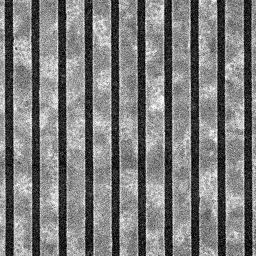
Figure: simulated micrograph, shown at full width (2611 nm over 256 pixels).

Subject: parallel lines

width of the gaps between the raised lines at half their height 84.2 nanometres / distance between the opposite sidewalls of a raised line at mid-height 184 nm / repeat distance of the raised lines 270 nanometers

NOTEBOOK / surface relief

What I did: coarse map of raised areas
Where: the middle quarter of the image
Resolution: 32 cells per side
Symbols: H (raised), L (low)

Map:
LHHHHLLHHHHHLLHHHHLLLHHHHLLHHHHL
LHHHHLLHHHHHLLHHHHLLLHHHHLLHHHHL
LHHHHLLHHHHHLLHHHHLLLHHHHLLHHHHL
LHHHHLLHHHHHLLHHHHLLLHHHHLLHHHHL
LHHHHLLHHHHHLLHHHHLLLHHHHLLHHHHL
LHHHHLLHHHHHLLHHHHLLLHHHHLLHHHHL
LHHHHLLHHHHHLLHHHHLLLHHHHLLHHHHL
LHHHHLLHHHHHLLHHHHLLLHHHHLLHHHHL
LHHHHLLHHHHHLLHHHHLLLHHHHLLHHHHL
LHHHHLLHHHHHLLHHHHLLLHHHHLLHHHHL
LHHHHLLHHHHHLLHHHHLLLHHHHLLHHHHL
LHHHHLLHHHHHLLHHHHLLLHHHHLLHHHHL
LHHHHLLHHHHHLLHHHHLLLHHHHLLHHHHL
LHHHHLLHHHHHLLHHHHLLLHHHHLLHHHHL
LHHHHLLHHHHHLLHHHHLLLHHHHLLHHHHH
LHHHHLLHHHHHLLHHHHLLLHHHHLLHHHHH
LHHHHLLHHHHLLLHHHHLLLHHHHLLHHHHH
LHHHHLLHHHHHLLHHHHLLLHHHHLLHHHHH
LHHHHLLHHHHLLLHHHHLLLHHHHLLHHHLH
LHHHHLLHHHHLLLHHHHLLLHHHHLLHHHHH
LHLLHLLHHHHHLLHHHHLLLHHHHLLHHHHH
LHHHHLLHHHHHLLHHHHLLLHHHHLLHHHLH
LHHHHLLHHHHHLLHHHHLLLHHHHLLHHHHH
LHHHHLLHHHHHLLHHHHLLLHHHHLLHHHHH
LHHHHLLHHHHHLLHHHHLLLHHHHLLHHHHH
LHHHHLLHHHHHLLHHHHLLLHHHHLLHHHHH
LHHHHLLHHHHHLLHHHHLLLHHHHLLHHHHH
LHHHHLLLHHHHLLHHHHLLLHHHHLLHHHHH
LHHHHLLLHHHHLLHHHHLLLHHHHLLHHHHH
LHHHHLLLHHHHLLHHHHLLLHHHHLLHHHHH
LHHHHLLLHHHHLLHHHHLLLHHHHLLHHHHH
LHHHHLLLHHHHLLHHHHLLLHHHHLLHHHHH